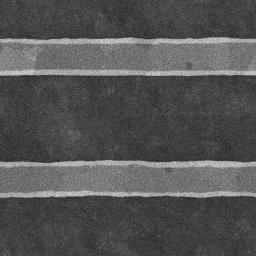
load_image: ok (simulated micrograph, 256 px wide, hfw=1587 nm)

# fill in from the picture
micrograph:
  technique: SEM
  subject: one or a few lines or trenches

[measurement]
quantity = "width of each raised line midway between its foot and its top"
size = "196 nm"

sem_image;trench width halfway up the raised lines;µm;0.562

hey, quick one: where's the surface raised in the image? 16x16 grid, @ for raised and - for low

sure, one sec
----------------
----------------
----------------
@@@@@@@@@@@@@@@@
@@--@@@@@@@@@@@@
----------------
----------------
----------------
----------------
----------------
@@@@@@@@@@@@@@@@
@@@@@@@@@@@@@@@@
----------------
----------------
----------------
----------------